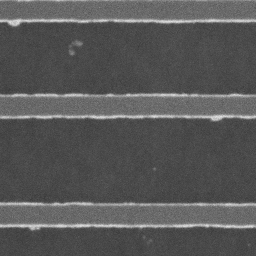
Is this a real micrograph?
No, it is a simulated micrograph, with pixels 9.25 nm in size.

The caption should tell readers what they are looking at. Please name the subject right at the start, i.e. lines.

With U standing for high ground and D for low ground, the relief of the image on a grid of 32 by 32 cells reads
UUUUUUUUUUUUUUUUUUUUUUUUUUUUUUUU
UUUUUUUUUUUUUUUUUUUUUUUUUUUUUUUU
UUUUUUUUUUUUUUUUUUUUUUUUUUUUUUUU
DDDDDDDDDDDDDDDDDDDDDDDDDDDDDDDD
DDDDDDDDDDDDDDDDDDDDDDDDDDDDDDDD
DDDDDDDDDDDDDDDDDDDDDDDDDDDDDDDD
DDDDDDDDDDDDDDDDDDDDDDDDDDDDDDDD
DDDDDDDDDDDDDDDDDDDDDDDDDDDDDDDD
DDDDDDDDDDDDDDDDDDDDDDDDDDDDDDDD
DDDDDDDDDDDDDDDDDDDDDDDDDDDDDDDD
DDDDDDDDDDDDDDDDDDDDDDDDDDDDDDDD
DDDDDDDDDDDDDDDDDDDDDDDDDDDDDDDD
UUUUUUUUUUUUUUUUUUUUUUUUUUUUUUUU
UUUUUUUUUUUUUUUUUUUUUUUUUUUUUUUU
UUUUUUUUUUUUUUUUUUUUUUUUUUUUUUUU
DDDDDDDDDDDDDDDDDDDDDDDDDDDDDDDD
DDDDDDDDDDDDDDDDDDDDDDDDDDDDDDDD
DDDDDDDDDDDDDDDDDDDDDDDDDDDDDDDD
DDDDDDDDDDDDDDDDDDDDDDDDDDDDDDDD
DDDDDDDDDDDDDDDDDDDDDDDDDDDDDDDD
DDDDDDDDDDDDDDDDDDDDDDDDDDDDDDDD
DDDDDDDDDDDDDDDDDDDDDDDDDDDDDDDD
DDDDDDDDDDDDDDDDDDDDDDDDDDDDDDDD
DDDDDDDDDDDDDDDDDDDDDDDDDDDDDDDD
DDDDDDDDDDDDDDDDDDDDDDDDDDDDDDDD
UUUUUUUUUUUUDDDDUDDDDDDDDDDDDDDD
UUUUUUUUUUUUUUUUUUUUUUUUUUUUUUUU
UUUUUUUUUUUUUUUUUUUUUUUUUUUUUUUU
DDDDDDDDDDDDDDDDDDDDDDDDDDDDDDDD
DDDDDDDDDDDDDDDDDDDDDDDDDDDDDDDD
DDDDDDDDDDDDDDDDDDDDDDDDDDDDDDDD
DDDDDDDDDDDDDDDDDDDDDDDDDDDDDDDD